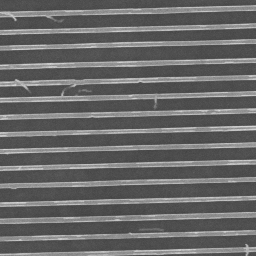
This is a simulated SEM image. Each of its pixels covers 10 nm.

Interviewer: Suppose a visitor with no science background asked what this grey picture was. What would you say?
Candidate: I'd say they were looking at parallel lines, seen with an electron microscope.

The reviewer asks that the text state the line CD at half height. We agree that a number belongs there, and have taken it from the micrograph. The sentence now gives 46.4 nm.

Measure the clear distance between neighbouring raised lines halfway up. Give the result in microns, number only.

0.128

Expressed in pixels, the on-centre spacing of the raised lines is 17.2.